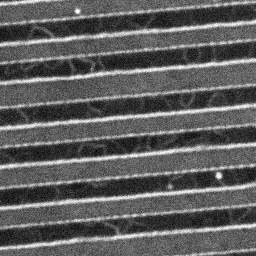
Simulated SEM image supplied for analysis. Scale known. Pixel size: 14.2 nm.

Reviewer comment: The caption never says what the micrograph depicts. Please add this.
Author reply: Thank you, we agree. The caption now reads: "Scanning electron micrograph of lines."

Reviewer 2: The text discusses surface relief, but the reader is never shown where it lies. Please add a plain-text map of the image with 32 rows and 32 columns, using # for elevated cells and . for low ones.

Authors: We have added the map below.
............................####
.................###############
......##########################
########################........
#############...................
##........................######
...............#################
....############################
######################..........
###########.....................
................................
.....................###########
..........######################
##############################..
##################..............
#######.........................
.....................###########
..........######################
#########################.......
#################...............
######..........................
......................##########
...........#####################
##############################..
##################..............
######..........................
.....................###########
...........#####################
############################....
#################...............
#######.........................
............................####